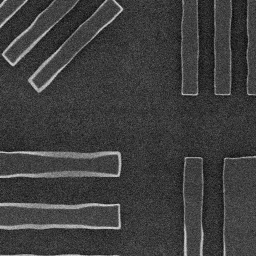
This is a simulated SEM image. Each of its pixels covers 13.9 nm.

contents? groups of lines, slits or small figures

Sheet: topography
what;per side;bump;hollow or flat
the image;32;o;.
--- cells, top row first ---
ooo...ooo....oo........oo..oo..o
oo...oooo...ooo........oo..oo..o
o...ooo....ooo.........oo..oo..o
....oo....ooo..........oo..oo..o
..ooo....ooo...........oo..oo..o
.ooo....ooo............oo..oo..o
.oo....ooo.............oo..oo..o
.o....ooo..............oo..oo..o
.....ooo...............oo..oo..o
....ooo................oo..oo..o
....oo.................oo..oo..o
.......................oo..oo..o
................................
................................
................................
................................
................................
................................
................................
ooooooooo...ooo.................
ooooooooooooooo........oo...oooo
ooooooooooooooo........oo...oooo
.......................oo...oooo
.......................oo...oooo
.......................oo...oooo
.......................oo...oooo
ooooooooooooooo........oo...oooo
ooooooooooooooo........oo...oooo
.......................oo...oooo
.......................oo...oooo
.......................oo...oooo
.......................oo...oooo